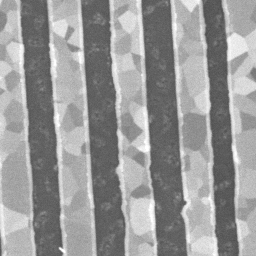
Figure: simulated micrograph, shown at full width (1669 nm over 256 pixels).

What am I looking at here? one or a few lines or trenches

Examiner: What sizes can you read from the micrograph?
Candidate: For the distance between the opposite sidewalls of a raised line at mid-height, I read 194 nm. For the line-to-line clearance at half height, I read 200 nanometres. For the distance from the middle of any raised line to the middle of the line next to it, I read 61.1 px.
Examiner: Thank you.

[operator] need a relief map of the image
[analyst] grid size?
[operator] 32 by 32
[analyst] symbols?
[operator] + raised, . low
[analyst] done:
++....++++....++++...++++...++++
++....++++....++++....+++...++++
++....++++....++++....+++...++++
++....++++....++++....+++...++++
++....++++....++++....+++....+++
+++...++++....++++....++++...+++
+++....+++....++++....++++...+++
+++....+++....++++....++++...+++
+++....+++....++++....++++...+++
+++....+++....++++....++++...+++
+++....++++...++++....++++...+++
+++....++++....+++....++++...+++
+++....++++....+++....++++...+++
+++....++++....+++....++++...+++
+++....++++....+++....++++...+++
+++....++++....+++....++++...+++
+++....++++....+++....++++...+++
+++....++++....+++.....+++...+++
+++....++++....++++....+++...+++
++++...++++....++++....+++...+++
++++...++++....++++....+++...+++
++++....+++....++++....+++....++
++++....+++....++++....+++....++
++++....+++....++++....+++....++
++++....+++....++++....++++...++
++++....++++...++++....++++...++
++++....++++....+++....++++...++
++++....++++....+++....++++...++
++++....++++....+++....++++...++
++++....++++....+++....++++...++
++++....++++....+++....++++...++
++++....++++....+++.....+++...++